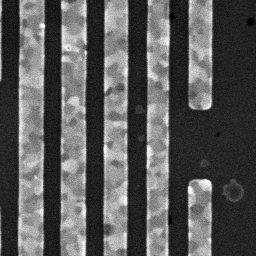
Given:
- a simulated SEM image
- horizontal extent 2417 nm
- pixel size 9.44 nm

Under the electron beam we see wiring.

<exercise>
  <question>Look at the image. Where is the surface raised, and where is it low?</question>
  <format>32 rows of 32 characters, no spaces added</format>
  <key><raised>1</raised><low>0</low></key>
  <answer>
00011100111001110001100011000000
00011100111001110001100011000000
00011100111001110001100011000000
00011100111001110001100011000000
00011000111001110001100011000000
00011000111001110001100011000000
00011000111001110001100011000000
00011000111001110001100011000000
00011000111001110001100011000000
00011000111001110001100011000000
00011000111001110001100011000000
00011000111001110001100011000000
00011000111001110001100011000000
00011000111001110001100011000000
00011000111001110001100000000000
00011000111001110001100000000000
00011000111001110001100000000000
00011000111001110001100000000000
00011000111001110001100000000000
00011000111001110001100000000000
00011000111001110011100000000000
00011000111001110011100000000000
00011000111001110011100000000000
00011000111001110011100011000000
00111000111001110001100011000000
00111000111001110001100011000000
00111000111001110001100011000000
00111000111001110011100011000000
00111000111001110011100011000000
00111000111001110011100011000000
00111000111001110011100011000000
00111000111001110011100011000000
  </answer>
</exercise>